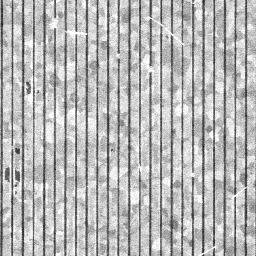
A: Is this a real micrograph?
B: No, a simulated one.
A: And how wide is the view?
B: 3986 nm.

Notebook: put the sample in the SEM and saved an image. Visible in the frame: parallel lines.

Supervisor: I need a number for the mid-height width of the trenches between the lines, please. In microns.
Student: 0.0389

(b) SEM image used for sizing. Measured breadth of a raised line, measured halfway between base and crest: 130 nanometres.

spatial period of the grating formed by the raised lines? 165 nm